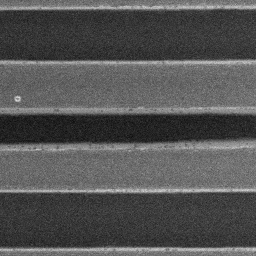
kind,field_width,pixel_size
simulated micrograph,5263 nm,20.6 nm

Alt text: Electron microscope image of lines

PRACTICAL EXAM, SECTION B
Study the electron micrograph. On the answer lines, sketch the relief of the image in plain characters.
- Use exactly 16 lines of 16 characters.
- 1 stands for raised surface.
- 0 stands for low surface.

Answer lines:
0000000000000000
0000000000000000
0000000000000000
0000000000000000
1111111111111111
1111111111111111
1111111111111111
0000000000000000
0000000000000000
1111111111111111
1111111111111111
1111111111111111
0000000000000000
0000000000000000
0000000000000000
0000000000000000